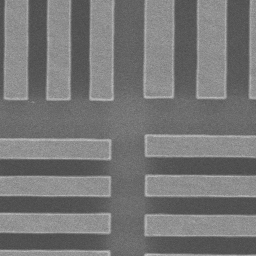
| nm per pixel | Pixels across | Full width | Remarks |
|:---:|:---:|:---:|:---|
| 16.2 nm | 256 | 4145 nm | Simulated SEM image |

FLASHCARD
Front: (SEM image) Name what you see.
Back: groups of lines, slits or small figures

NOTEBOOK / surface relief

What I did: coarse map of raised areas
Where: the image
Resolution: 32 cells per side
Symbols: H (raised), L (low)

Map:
LHHHLLHHHLLHHHLLLLHHHHLLLHHHLLLH
LHHHLLHHHLLHHHLLLLHHHHLLLHHHLLLH
LHHLLLHHHLLHHHLLLLHHHHLLLHHHLLLH
LHHLLLHHHLLHHHLLLLHHHHLLLHHHLLLH
LHHLLLHHHLLHHHLLLLHHHHLLLHHHLLLH
LHHLLLHHHLLHHHLLLLHHHHLLLHHHLLLH
LHHLLLHHHLLHHHLLLLHHHHLLLHHHLLLH
LHHLLLHHHLLHHHLLLLHHHHLLLHHHLLLH
LHHLLLHHHLLHHHLLLLHHHHLLLHHHLLLH
LHHLLLHHHLLHHHLLLLHHHHLLLHHHLLLH
LHHLLLHHHLLHHHLLLLHHHHLLLHHHLLLH
LHHLLLHHHLLHHHLLLLHHHHLLLHHHLLLH
LLLLLLLLLLLLLLLLLLLLLLLLLLLLLLLL
LLLLLLLLLLLLLLLLLLLLLLLLLLLLLLLL
LLLLLLLLLLLLLLLLLLLLLLLLLLLLLLLL
LLLLLLLLLLLLLLLLLLLLLLLLLLLLLLLL
LLLLLLLLLLLLLLLLLLLLLLLLLLLLLLLL
HHHHHHHHHHHHLLLLLLHHHHHHHHHHHHHH
HHHHHHHHHHHHHHLLLLHHHHHHHHHHHHHH
HHHHHHHHHHHHHHLLLLHHHHHHHHHHHHHH
LLLLLLLLLLLLLLLLLLLLLLLLLLLLLLLL
LLLLLLLLLLLLLLLLLLLLLLLLLLLLLLLL
HHHHHHHHHHHHHHLLLLHHHHHHHHHHHHHH
HHHHHHHHHHHHHHLLLLHHHHHHHHHHHHHH
HHHHHHHHHHHHHLLLLLHHHHHHHHHHHHHH
LLLLLLLLLLLLLLLLLLLLLLLLLLLLLLLL
LLLLLLLLLLLLLLLLLLLLLLLLLLLLLLLL
HHHHHHHHHHHHHHLLLLHHHHHHHHHHHHHH
HHHHHHHHHHHHHHLLLLHHHHHHHHHHHHHH
LLLLLLLLLLLLLLLLLLLLLLLLLLLLLLLL
LLLLLLLLLLLLLLLLLLLLLLLLLLLLLLLL
HHHHHHHHHHHHHLLLLLLLLLLLLLLLLLLL